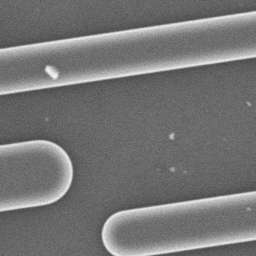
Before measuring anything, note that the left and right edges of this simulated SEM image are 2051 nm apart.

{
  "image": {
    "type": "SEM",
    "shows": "groups of lines, slits or small figures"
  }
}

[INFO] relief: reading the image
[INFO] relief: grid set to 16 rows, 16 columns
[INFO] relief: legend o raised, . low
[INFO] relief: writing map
................
...........ooooo
....oooooooooooo
oooooooooooooooo
ooooooooo.......
oo..............
................
................
................
oooo............
oooo............
oooo............
ooo..........ooo
.......ooooooooo
......oooooooooo
.......ooooo....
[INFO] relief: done